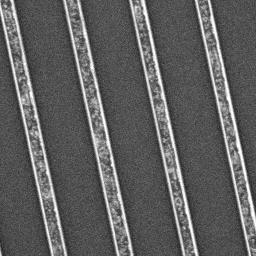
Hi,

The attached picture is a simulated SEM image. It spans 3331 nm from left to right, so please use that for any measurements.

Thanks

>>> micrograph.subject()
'one or a few lines or trenches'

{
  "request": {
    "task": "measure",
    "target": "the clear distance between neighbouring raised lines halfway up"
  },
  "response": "668 nm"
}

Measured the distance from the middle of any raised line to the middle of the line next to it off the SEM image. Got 64.2 pixels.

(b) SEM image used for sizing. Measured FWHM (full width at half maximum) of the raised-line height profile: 0.164 um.